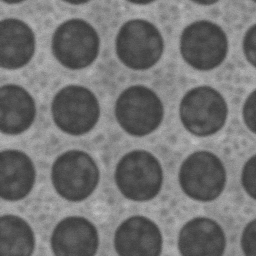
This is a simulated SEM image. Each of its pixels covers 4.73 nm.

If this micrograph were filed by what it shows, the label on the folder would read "a regular array of holes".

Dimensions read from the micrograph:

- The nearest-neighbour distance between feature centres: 302 nm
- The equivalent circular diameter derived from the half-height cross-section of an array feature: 246 nm